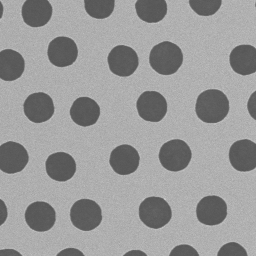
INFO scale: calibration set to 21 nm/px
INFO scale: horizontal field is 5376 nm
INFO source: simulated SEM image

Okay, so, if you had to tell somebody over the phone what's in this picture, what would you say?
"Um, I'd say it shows a regular array of holes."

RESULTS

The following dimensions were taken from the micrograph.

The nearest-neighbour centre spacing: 1060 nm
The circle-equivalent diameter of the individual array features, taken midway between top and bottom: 655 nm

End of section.